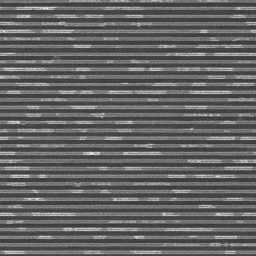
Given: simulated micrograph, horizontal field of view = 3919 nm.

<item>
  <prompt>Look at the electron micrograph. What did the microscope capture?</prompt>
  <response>parallel lines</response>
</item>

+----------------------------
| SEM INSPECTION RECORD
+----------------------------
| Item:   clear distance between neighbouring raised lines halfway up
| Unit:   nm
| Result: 76.5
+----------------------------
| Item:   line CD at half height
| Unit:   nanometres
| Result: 45.9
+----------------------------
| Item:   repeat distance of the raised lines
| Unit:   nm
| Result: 117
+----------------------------